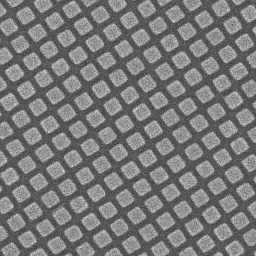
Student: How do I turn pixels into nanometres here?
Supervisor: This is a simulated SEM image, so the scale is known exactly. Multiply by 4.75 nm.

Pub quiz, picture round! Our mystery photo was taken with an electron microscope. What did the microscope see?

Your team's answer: a regular array of raised bodies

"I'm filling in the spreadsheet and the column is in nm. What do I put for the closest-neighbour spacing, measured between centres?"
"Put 97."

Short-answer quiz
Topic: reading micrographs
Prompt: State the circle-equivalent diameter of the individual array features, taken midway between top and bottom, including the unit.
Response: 0.0747 µm